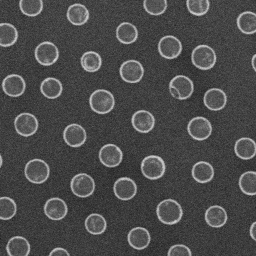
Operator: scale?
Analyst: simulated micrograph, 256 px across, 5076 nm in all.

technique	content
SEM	a regular array of raised bodies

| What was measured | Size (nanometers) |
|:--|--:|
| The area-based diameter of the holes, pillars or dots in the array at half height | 432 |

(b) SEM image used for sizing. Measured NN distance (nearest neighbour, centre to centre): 767 nanometers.